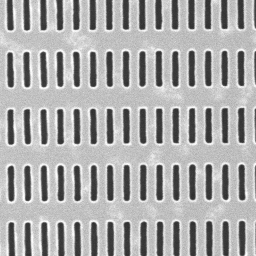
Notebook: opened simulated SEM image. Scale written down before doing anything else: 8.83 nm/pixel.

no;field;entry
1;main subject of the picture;a regular array of holes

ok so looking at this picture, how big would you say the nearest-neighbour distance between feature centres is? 143 nm